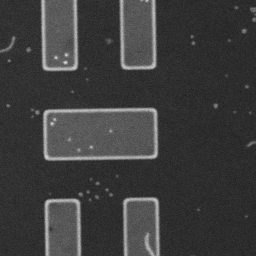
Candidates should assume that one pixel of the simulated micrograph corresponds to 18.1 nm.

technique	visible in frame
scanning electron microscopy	groups of lines, slits or small figures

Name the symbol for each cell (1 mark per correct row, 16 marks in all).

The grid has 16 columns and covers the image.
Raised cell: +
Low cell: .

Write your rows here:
...++...++......
...++...++......
...++...++......
...++...++......
................
................
................
...+++++++......
...+++++++......
...+++++++......
................
................
........+.......
...++...++......
...++...++......
...++...++......